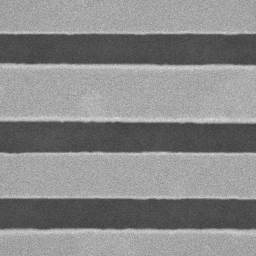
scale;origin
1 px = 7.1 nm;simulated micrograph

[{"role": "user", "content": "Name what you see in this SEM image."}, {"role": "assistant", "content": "lines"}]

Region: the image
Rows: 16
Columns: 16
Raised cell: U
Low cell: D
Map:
UUUUUUUUUUUUUUUU
UUUUUUUUUUUUUUUU
DDDDDDDDDDDDDDDD
DDDDDDDDDDDDDDDD
UUUUUUUUUUUUUUUU
UUUUUUUUUUUUUUUU
UUUUUUUUUUUUUUUU
UUUUUUUUUUUUUUUU
DDDDDDDDDDDDDDDD
DDDDDDDDDDDDDDDD
UUUUUUUUUUUUUUUU
UUUUUUUUUUUUUUUU
DDDDDDDDDDDDDDDD
DDDDDDDDDDDDDDDD
UUUUUUUUUUUUUUUU
UUUUUUUUUUUUUUUU